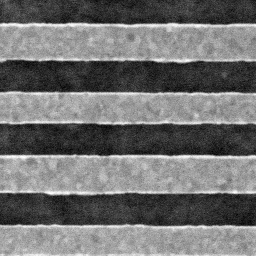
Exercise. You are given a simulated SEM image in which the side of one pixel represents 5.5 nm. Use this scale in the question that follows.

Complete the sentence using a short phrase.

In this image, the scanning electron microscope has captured lines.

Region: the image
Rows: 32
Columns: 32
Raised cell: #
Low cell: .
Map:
................................
................................
................................
################################
################################
################################
################################
.....................###########
................................
................................
................................
................................
################################
################################
################################
................................
................................
................................
................................
#.###########.#######.#####....#
################################
################################
################################
################################
................................
................................
................................
................................
################################
################################
################################
################################